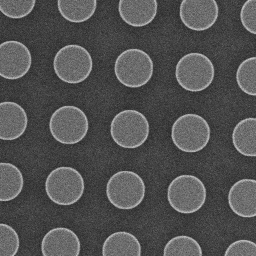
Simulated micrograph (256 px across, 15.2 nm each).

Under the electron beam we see an array of small figures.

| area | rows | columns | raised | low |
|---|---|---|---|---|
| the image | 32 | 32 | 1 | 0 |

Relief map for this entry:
11110001111100011111000111100001
11110000111100011110000111100011
00000000011000001110000111100011
00000000000000000000000011000001
00000000000000000000000000000000
11100000000000000000000000000000
11110001111000001100000000000000
11110001111000011110000111000001
11110001111000111110001111100011
11100001111000011110001111100011
00000000000000011100001111000011
00000000000000000000000000000001
00000000000000000000000000000000
11100000110000000000000000000000
11100001111000011100000110000000
11100011111000111110001111000011
11100011111000111110001111000111
00000001110000111100001111000111
00000000000000000000001110000011
00000000000000000000000000000000
10000000000000000000000000000000
11100001110000010000000000000000
11100011110000111100001110000011
11100011110001111100011111000111
11000011110001111100011111000111
00000001100000111000011110000111
00000000000000000000000100000111
00000000000000000000000000000000
10000001000000000000000000000000
11000011110000111000000000000000
11000111110001111000011110000111
11000111110001111100011110001111